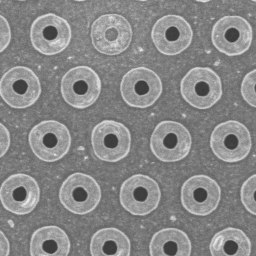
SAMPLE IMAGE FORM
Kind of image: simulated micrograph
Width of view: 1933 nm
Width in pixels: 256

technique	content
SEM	a regular array of ring-shaped raised bodies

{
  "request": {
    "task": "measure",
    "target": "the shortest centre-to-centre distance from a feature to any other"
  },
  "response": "0.454 microns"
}